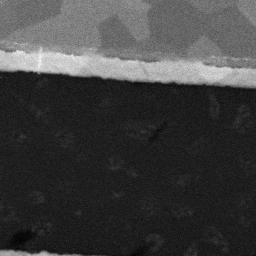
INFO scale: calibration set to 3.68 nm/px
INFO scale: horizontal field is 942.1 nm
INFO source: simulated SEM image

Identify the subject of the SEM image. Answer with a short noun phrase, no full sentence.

one or a few lines or trenches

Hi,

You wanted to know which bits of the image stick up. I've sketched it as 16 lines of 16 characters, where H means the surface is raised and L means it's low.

HHHHHHHHHHHHHHHH
HHHHHHHHHHHHHHHH
HHHHHHHHHHHHHHHH
HHHHHHHHHHHHHHHH
LLLLLLLLLLLLLHHH
LLLLLLLLLLLLLLLL
LLLLLLLLLLLLLLLL
LLLLLLLLLLLLLLLL
LLLLLLLLLLLLLLLL
LLLLLLLLLLLLLLLL
LLLLLLLLLLLLLLLL
LLLLLLLLLLLLLLLL
LLLLLLLLLLLLLLLL
LLLLLLLLLLLLLLLL
LLLLLLLLLLLLLLLL
LLLLLLLLLLLLLLLL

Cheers